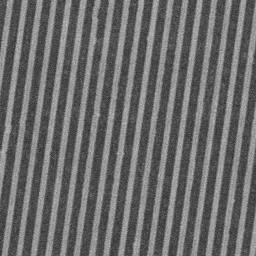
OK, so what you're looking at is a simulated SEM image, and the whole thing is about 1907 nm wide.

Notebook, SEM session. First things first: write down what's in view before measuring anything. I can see parallel lines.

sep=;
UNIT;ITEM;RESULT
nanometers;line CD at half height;29.5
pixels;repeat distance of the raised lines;14.4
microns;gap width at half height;0.0739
